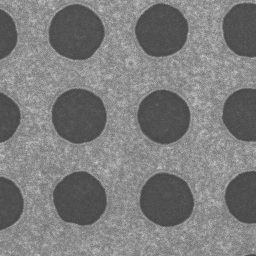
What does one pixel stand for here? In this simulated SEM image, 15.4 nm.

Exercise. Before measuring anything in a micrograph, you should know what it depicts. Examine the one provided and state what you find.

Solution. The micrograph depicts holes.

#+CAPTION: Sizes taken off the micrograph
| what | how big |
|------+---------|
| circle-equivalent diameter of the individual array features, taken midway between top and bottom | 838 nm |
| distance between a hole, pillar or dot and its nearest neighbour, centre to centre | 83.1 pixels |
